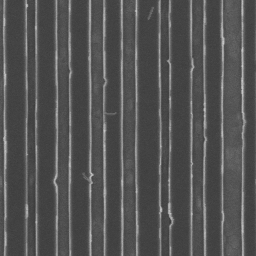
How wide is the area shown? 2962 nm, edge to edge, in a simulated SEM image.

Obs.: parallel lines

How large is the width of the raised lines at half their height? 252 nanometers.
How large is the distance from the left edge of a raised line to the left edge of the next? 382 nm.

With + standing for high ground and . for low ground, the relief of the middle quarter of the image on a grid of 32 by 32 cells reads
..++++....++++....++++++...+++++
..++++....++++....++++++...+++++
..++++....++++....++++++...+++++
..++++....++++....++++++...+++++
..++++....++++....++++++...+++++
..++++....++++....++++++...+++++
..++++....++++....++++++..++++++
..++++....++++....++++++..++++++
..++++....++++....++++++..++++++
..++++....++++....++++++...+++++
..++++....++++....++++++...+++++
..++++....++++....++++++...+++++
..++++....++++....++++++...+++++
..++++....++++....++++++...+++++
..++++....++++....++++++...+++++
..+++++...++++....++++++..++++++
..+++++...++++....++++++..++++++
..+++++...++++....++++++...+++++
..+++++...++++....++++++...+++++
..+++++...++++....++++++...+++++
..+++++...++++....++++++...+++++
..+++++...++++....++++++..++++++
..+++++...++++....++++++..++++++
.++++++...++++....++++++..++++++
.++++++...++++....++++++..++++++
.++++++...++++....++++++..++++++
.++++++...++++....++++++..++++++
.++++++...++++....++++++..++++++
.++++++...++++....++++++..++++++
.++++++...+++++...++++++..++++++
.++++++...+++++...++++++..++++++
.++++++...++++....++++++..++++++